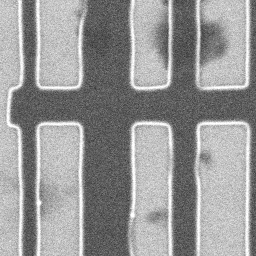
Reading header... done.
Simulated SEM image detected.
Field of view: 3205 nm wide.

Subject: groups of lines, slits or small figures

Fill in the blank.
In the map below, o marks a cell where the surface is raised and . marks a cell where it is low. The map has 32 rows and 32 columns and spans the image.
..ooo......oooooo....oooo......o
..ooo.....ooooooo....oooo......o
..ooo.....ooooooo....oooo......o
...oo.....ooooooo....oooo......o
...oo.....ooooooo....oooo......o
...oo.....ooooooo....oooo......o
...oo.....ooooooo....oooo......o
...oo.....ooooooo....oooo......o
...oo.....ooooooo....oooo......o
...oo.....ooooooo....oooo......o
..ooo.....ooooooo....oooo......o
.ooooooooooooooooooooooooooooooo
.ooooooooooooooooooooooooooooooo
.ooooooooooooooooooooooooooooooo
.ooooooooooooooooooooooooooooooo
.ooooooooooooooooo.ooooooo....oo
..ooo.....ooooooo....oooo......o
..ooo.....ooooooo....oooo......o
..ooo.....ooooooo....oooo......o
..ooo.....ooooooo....oooo......o
..ooo.....ooooooo....oooo......o
..ooo.....ooooooo....oooo......o
...oo.....ooooooo....oooo......o
...oo.....ooooooo....oooo......o
...oo.....ooooooo....oooo......o
...oo.....ooooooo....oooo......o
...oo.....ooooooo....oooo......o
...oo.....ooooooo....oooo......o
...oo.....oooooo.....oooo......o
...oo.....oooooo.....oooo......o
...oo.....oooooo.....oooo......o
...oo.....ooooooo....oooo......o